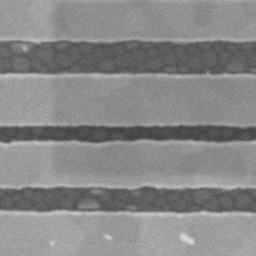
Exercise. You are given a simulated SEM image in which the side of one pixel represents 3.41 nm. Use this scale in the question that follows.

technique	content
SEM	lines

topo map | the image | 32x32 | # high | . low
################################
################################
################################
################################
################################
................................
................................
................................
................................
################################
################################
################################
################################
################################
################################
################################
................................
.................##.............
################################
################################
################################
################################
################################
..#.............#...........#...
................................
................................
#####.#######..#.........#......
################################
################################
################################
################################
################################